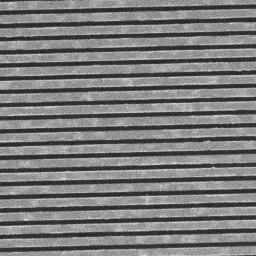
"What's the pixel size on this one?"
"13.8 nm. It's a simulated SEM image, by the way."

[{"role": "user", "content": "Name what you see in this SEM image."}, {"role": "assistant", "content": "parallel lines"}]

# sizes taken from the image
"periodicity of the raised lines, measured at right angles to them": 13.2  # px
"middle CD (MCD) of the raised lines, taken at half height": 112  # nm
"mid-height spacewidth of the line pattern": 73.9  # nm